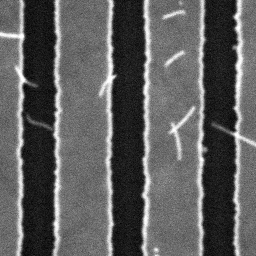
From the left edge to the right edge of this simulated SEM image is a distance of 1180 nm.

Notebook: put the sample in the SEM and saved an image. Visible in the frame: lines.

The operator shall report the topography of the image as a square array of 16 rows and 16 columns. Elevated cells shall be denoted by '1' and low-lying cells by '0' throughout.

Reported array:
1001111001111001
1001111001111001
1000111001111001
1001111001111001
1001111001111001
1001111001111001
1001111001111001
1001111001111001
1001111001111001
1001111001111001
1001111001111001
1001111001111001
1001111001111001
1001111001111001
1001111001111001
1001111001111001